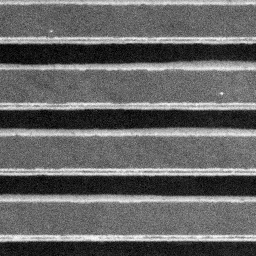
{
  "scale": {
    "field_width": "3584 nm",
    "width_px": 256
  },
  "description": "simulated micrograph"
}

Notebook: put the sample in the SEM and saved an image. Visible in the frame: lines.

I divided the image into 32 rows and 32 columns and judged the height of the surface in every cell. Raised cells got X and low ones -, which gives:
XXXXXXXXXXXXXXXXXXXXXXXXXXXXXXXX
XXXXXXXXXXXXXXXXXXXXXXXXXXXXXXXX
XXXXXXXXXXXXXXXXXXXXXXXXXXXXXXXX
XXXXXXXXXXXXXXXXXXXXXXXXXXXXXXXX
XXXXXXXXXXXXXXXXXXXXXXXXXXXXXXXX
--------------------------------
--------------------------------
--------------------------------
-----------------X--XXXXXXXXXXXX
XXXXXXXXXXXXXXXXXXXXXXXXXXXXXXXX
XXXXXXXXXXXXXXXXXXXXXXXXXXXXXXXX
XXXXXXXXXXXXXXXXXXXXXXXXXXXXXXXX
XXXXXXXXXXXXXXXXXXXXXXXXXXXXXXXX
XXX-X-XXXX-----XXXXXXX-XXXXXX---
--------------------------------
--------------------------------
--------------------------------
XXXXXXXXXXXXXXXXXXXXXXXXXXXXXXXX
XXXXXXXXXXXXXXXXXXXXXXXXXXXXXXXX
XXXXXXXXXXXXXXXXXXXXXXXXXXXXXXXX
XXXXXXXXXXXXXXXXXXXXXXXXXXXXXXXX
XXXXXXXXXXXXXXXXXXXXXXXXXXXXXXXX
--------------------------------
--------------------------------
--------------------------------
XXXXXXXXXXXXXXXXXXXXXXXXXXXXXXXX
XXXXXXXXXXXXXXXXXXXXXXXXXXXXXXXX
XXXXXXXXXXXXXXXXXXXXXXXXXXXXXXXX
XXXXXXXXXXXXXXXXXXXXXXXXXXXXXXXX
XXXXXXXXXXXXXXXXXXXXXXXXXXXXXXXX
--------------------------------
--------------------------------